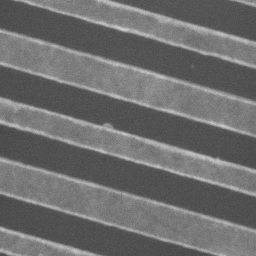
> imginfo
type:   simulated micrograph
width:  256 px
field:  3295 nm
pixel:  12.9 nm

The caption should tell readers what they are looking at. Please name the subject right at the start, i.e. lines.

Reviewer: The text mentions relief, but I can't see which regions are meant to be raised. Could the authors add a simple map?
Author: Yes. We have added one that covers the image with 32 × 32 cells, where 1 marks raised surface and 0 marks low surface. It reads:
00001111111111100000000000000001
00000001111111111110000000000000
00000000000111111111110000000000
00000000000000111111111111000000
11100000000000000011111111111000
11111110000000000000011111111111
11111111110000000000000001111111
11111111111111000000000000001111
00111111111111111000000000000000
00000111111111111111000000000000
00000000111111111111111100000000
00000000000011111111111111100000
10000000000000011111111111111110
11111000000000000001111111111111
11111111000000000000000111111111
11111111111100000000000000111111
00001111111111100000000000000011
00000001111111111110000000000000
00000000000111111111111000000000
00000000000000111111111111000000
11100000000000000111111111111000
11111100000000000000011111111111
11111111110000000000000001111111
11111111111111000000000000000111
01111111111111111000000000000000
00001111111111111111000000000000
00000000111111111111111100000000
00000000000111111111111111110000
00000000000000011111111111111110
11110000000000000011111111111111
11111110000000000000001111111111
11111111111000000000000000111111